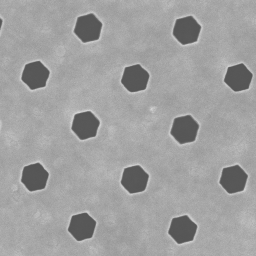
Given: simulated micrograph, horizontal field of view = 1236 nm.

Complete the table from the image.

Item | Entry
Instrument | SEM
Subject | a regular array of holes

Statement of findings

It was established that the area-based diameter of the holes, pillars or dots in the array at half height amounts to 129 nanometres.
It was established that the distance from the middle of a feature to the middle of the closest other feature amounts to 335 nanometers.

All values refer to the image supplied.